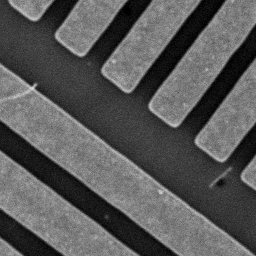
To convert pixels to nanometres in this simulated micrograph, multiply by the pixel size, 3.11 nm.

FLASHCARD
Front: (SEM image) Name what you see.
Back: groups of lines, slits or small figures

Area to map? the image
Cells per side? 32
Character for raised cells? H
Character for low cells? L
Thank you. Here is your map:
LHHHHHLLLLHHHHHLLLLHHHHHHLLLHHHH
LLLHHLLLLHHHHHHLLLHHHHHHLLLHHHHH
LLLLLLLLHHHHHHLLLHHHHHHLLLHHHHHH
LLLLLLLHHHHHHLLLLHHHHHLLLLHHHHHH
LLLLLLLHHHHHLLLLHHHHHHLLLHHHHHHL
LLLLLLLLHHHHLLLHHHHHHLLLHHHHHHLL
LLLLLLLLLHHLLLHHHHHHLLLHHHHHHLLL
LLLLLLLLLLLLLLHHHHHLLLLHHHHHLLLL
HLLLLLLLLLLLLHHHHHHLLLHHHHHHLLLH
HHLLLLLLLLLLLHHHHHLLLHHHHHHLLLHH
HHHLLLLLLLLLLLHHHLLLHHHHHHLLLLHH
HHHHHLLLLLLLLLLLLLLLHHHHHHLLLHHH
HHHHHHLLLLLLLLLLLLLHHHHHHLLLHHHH
HHHHHHHLLLLLLLLLLLLHHHHHLLLHHHHH
HHHHHHHHHLLLLLLLLLLLHHHLLLLHHHHH
LHHHHHHHHHLLLLLLLLLLLHLLLLHHHHHH
LLHHHHHHHHHLLLLLLLLLLLLLLHHHHHHL
LLLHHHHHHHHHHLLLLLLLLLLLLHHHHHLL
LLLLLHHHHHHHHHLLLLLLLLLLLHHHHLLL
HLLLLLHHHHHHHHHLLLLLLLLLLLHHHLLL
HHLLLLLHHHHHHHHHHLLLLLLLLLLLLLLH
HHHHLLLLLHHHHHHHHHLLLLLLLLLLLLHH
HHHHHLLLLLHHHHHHHHHLLLLLLLLLLLHH
HHHHHHLLLLLHHHHHHHHHHLLLLLLLLLLL
HHHHHHHLLLLLLHHHHHHHHHLLLLLLLLLL
HHHHHHHHHLLLLLHHHHHHHHHLLLLLLLLL
LHHHHHHHHHLLLLLHHHHHHHHHHLLLLLLL
LLHHHHHHHHHHLLLLLHHHHHHHHHLLLLLL
LLLHHHHHHHHHHLLLLLHHHHHHHHHLLLLL
LLLLLHHHHHHHHHLLLLLHHHHHHHHHHLLL
HLLLLLHHHHHHHHHLLLLLLHHHHHHHHHLL
HHLLLLLHHHHHHHHHHLLLLLHHHHHHHHHL